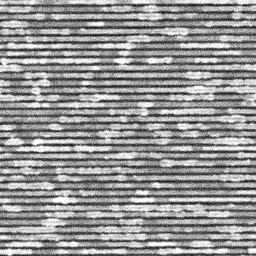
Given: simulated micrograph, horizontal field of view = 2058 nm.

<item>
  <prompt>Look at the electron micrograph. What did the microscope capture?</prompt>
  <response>parallel lines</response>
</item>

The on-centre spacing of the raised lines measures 59 nm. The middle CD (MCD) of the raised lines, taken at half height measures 0.0302 um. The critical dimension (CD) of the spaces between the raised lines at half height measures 0.0302 micrometres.